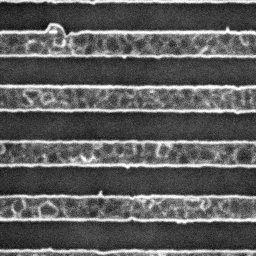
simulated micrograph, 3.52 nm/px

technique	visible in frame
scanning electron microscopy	parallel lines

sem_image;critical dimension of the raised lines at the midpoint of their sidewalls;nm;85.3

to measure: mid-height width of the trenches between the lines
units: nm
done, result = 109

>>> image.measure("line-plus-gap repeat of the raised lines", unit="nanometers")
193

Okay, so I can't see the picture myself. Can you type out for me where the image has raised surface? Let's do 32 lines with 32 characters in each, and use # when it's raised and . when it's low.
................................
................................
................................
......##........................
################################
################################
################################
................................
................................
................................
................................
################################
################################
################################
................................
................................
................................
................................
################################
################################
################################
................................
................................
................................
............#......#............
################################
################################
..................##############
................................
................................
................................
############.#####...#..########